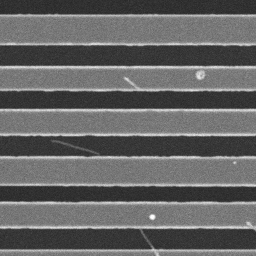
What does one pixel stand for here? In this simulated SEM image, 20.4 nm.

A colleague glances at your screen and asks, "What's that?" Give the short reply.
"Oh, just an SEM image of lines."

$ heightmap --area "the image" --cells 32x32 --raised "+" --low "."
................................
................................
++++++++++++++++++++++++++++++++
++++++++++++++++++++++++++++++++
++++++++++++++++++++++++++++++++
++++++++++++++++++++++++++++++++
................................
................................
++++++++++++++++++++++++++++++++
++++++++++++++++++++++++++++++++
++++++++++++++++++++++++++++++++
................................
................................
................................
++++++++++++++++++++++++++++++++
++++++++++++++++++++++++++++++++
++++++++++++++++++++++++++++++++
................................
................................
................................
++++++++++++++++++++++++++++++++
++++++++++++++++++++++++++++++++
++++++++++++++++++++++++++++++++
................................
................................
++++++++++++++++++++++++++++++++
++++++++++++++++++++++++++++++++
++++++++++++++++++++++++++++++++
++++++++++++++++++++++++++++++++
................................
................................
++++++++++++++++++++++++++++++++